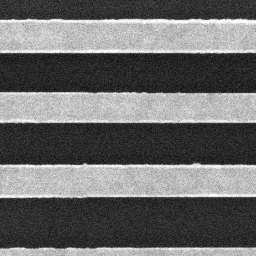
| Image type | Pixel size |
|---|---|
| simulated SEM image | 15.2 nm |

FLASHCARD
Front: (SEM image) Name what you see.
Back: lines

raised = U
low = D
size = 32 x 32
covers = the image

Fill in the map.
DDDDDDDDDDDDDDDDDDDDDDDDDDDDDDDD
DDDDDDDDDDDDDDDDDDDDDDDDDDDDDDDD
DDDUUDUUDDDDDUUUUUUUUUDUUUUUUUUD
UUUUUUUUUUUUUUUUUUUUUUUUUUUUUUUU
UUUUUUUUUUUUUUUUUUUUUUUUUUUUUUUU
UUUUUUUUUUUUUUUUUUUUUUUUUUUUUUUU
UUUUUUUUUUUUUUUUUUUUUUUUUUUUUUUU
DDDDDDDDDDDDDDDDDDDDDDDDDDDDDDDD
DDDDDDDDDDDDDDDDDDDDDDDDDDDDDDDD
DDDDDDDDDDDDDDDDDDDDDDDDDDDDDDDD
DDDDDDDDDDDDDDDDDDDDDDDDDDDDDDDD
DDDDDDDDDDDDDDDDDDDDDDDDDDDDDDDD
UUUUUUUUUUUUUUUUUUUUUUUUUUUUUUUU
UUUUUUUUUUUUUUUUUUUUUUUUUUUUUUUU
UUUUUUUUUUUUUUUUUUUUUUUUUUUUUUUU
DDDDDDDDDDDDDDDDDDDDDDDDDDDDDDDD
DDDDDDDDDDDDDDDDDDDDDDDDDDDDDDDD
DDDDDDDDDDDDDDDDDDDDDDDDDDDDDDDD
DDDDDDDDDDDDDDDDDDDDDDDDDDDDDDDD
DDDDDDDDDDDDDDDDDDDDDDDDDDDDDDDD
DDDDDDDDDDDDDDDDDDDDDDDDDDDDDDDD
UUUUUUUUUUUUUUUUUUUUUUUUUUUUUUUU
UUUUUUUUUUUUUUUUUUUUUUUUUUUUUUUU
UUUUUUUUUUUUUUUUUUUUUUUUUUUUUUUU
UUUUUUUUUUUUUUUUUUUUUUUUUUUUUUUU
DDDDDDDDDDDDDDDDDDDDDDDDDDDDDDDD
DDDDDDDDDDDDDDDDDDDDDDDDDDDDDDDD
DDDDDDDDDDDDDDDDDDDDDDDDDDDDDDDD
DDDDDDDDDDDDDDDDDDDDDDDDDDDDDDDD
DDDDDDDDDDDDDDDDDDDDDDDDDDDDDDDD
DDDDDDDDDDDDDDDDDDDDDDDDDDDDDDDD
UUUUUUUUUUUUUUUUUUUUUUUUUUUUUUUU